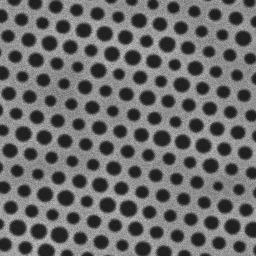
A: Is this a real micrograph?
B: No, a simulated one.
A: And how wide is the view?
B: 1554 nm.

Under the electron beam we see a regular array of holes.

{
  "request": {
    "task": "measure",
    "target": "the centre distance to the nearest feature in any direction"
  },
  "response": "128 nm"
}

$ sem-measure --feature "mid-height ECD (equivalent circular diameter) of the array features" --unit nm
83.1